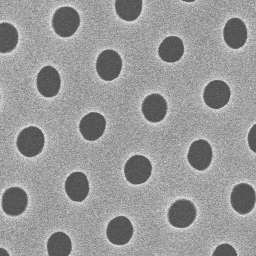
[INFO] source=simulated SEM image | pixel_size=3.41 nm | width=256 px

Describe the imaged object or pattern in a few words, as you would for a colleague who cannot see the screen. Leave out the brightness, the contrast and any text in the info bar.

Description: a regular array of holes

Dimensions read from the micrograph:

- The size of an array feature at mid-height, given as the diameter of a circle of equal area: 93.9 nanometres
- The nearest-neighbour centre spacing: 210 nm